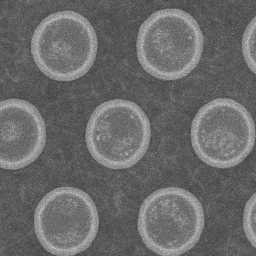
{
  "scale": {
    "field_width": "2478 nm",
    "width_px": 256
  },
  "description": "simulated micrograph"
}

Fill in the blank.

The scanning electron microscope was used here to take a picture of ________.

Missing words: raised bodies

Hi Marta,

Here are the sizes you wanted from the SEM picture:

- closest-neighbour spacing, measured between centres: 0.988 um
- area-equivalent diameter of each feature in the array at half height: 597 nm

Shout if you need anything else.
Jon